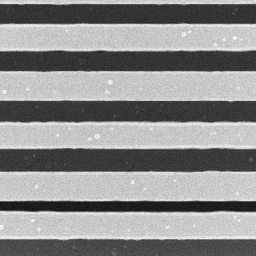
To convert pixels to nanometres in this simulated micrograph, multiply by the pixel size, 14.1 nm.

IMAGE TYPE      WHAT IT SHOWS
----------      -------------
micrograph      lines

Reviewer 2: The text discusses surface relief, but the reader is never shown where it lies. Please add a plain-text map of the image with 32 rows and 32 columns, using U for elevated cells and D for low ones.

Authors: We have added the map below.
DDDDDDDUUDDDDDDDDDDDDDDDDDDDDDDD
DDDDDDDDDDDDDDDDDDDDDDDDDDDDDDDD
DDDDDDDDDDDDDDDDDDDDDDDDDDDDDDDD
UUUUUUUUUUUUUUUUUUUUUUUUUUUUUUUU
UUUUUUUUUUUUUUUUUUUUUUUUUUUUUUUU
UUUUUUUUUUUUUUUUUUUUUUUUUUUUUUUU
DDDDDDDDDDDDDDDDDDDDDDDDDDDDDDDD
DDDDDDDDDDDDDDDDDDDDDDDDDDDDDDDD
DDDDDDDDDDDDDDDDDDDDDDDDDDDDDDDD
UUUUUUUUUUUUUUUUUUUUUUUUUUUUUUUU
UUUUUUUUUUUUUUUUUUUUUUUUUUUUUUUU
UUUUUUUUUUUUUUUUUUUUUUUUUUUUUUUU
UUUUUUUUUUUUUUUUUUUUUUUUUUUUUUUU
DDDDDDDDDDDDDDDDDDDDDDDDDDDDDDDD
DDDDDDDDDDDDDDDDDDDDDDDDDDDDDDDD
UUUUUUUUUUUUUUUUUUUUUUUUUUUUUUUU
UUUUUUUUUUUUUUUUUUUUUUUUUUUUUUUU
UUUUUUUUUUUUUUUUUUUUUUUUUUUUUUUU
UUUUUUUDDUUUUUUUUUUUUUUUUUUDUUUU
DDDDDDDDDDDDDDDDDDDDDDDDDDDDDDDD
DDDDDDDDDDDDDDDDDDDDDDDDDDDDDDDD
DDDDDDDDDDDDDDDDDDDDDDDDDUUUUDDD
UUUUUUUUUUUUUUUUUUUUUUUUUUUUUUUU
UUUUUUUUUUUUUUUUUUUUUUUUUUUUUUUU
UUUUUUUUUUUUUUUUUUUUUUUUUUUUUUUU
DDDDDDDDDDDDDDDDDDDDDDDDDDDDDDDD
UUUUDUUDDDDDDDDDDDDDDDDDDDDUUDDD
UUUUUUUUUUUUUUUUUUUUUUUUUUUUUUUU
UUUUUUUUUUUUUUUUUUUUUUUUUUUUUUUU
UUUUUUUUUUUUUUUUUUUUUUUUUUUUUUUU
DDDDDDDDDDDDDDDDDDDDDDDDDDDDDDDD
DDDDDDDDDDDDDDDDDDDDDDDDDDDDDDDD